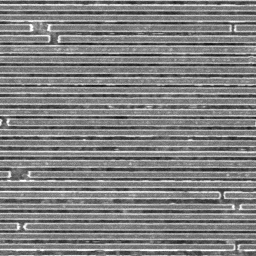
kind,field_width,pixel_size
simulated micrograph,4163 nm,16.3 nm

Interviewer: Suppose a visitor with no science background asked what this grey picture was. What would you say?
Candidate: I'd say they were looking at parallel lines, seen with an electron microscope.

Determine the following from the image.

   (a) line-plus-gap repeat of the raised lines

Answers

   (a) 169 nm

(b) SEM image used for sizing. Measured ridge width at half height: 110 nm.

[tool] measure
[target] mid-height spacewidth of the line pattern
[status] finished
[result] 63 nanometers